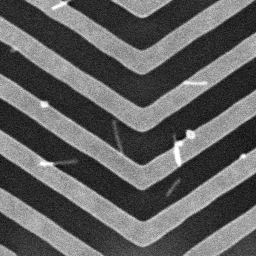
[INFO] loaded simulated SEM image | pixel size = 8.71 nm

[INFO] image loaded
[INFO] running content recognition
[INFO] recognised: groups of lines, slits or small figures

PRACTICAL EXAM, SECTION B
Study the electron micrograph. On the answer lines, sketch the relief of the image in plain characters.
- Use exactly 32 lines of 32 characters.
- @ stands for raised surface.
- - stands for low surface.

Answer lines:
----@@@@-------@@@@@@------@@@@-
-----@@@@@------@@@------@@@@@--
@------@@@@-------------@@@@----
@@-------@@@@---------@@@@@-----
@@@@------@@@@-------@@@@------@
-@@@@-------@@@@---@@@@-------@@
--@@@@@------@@@@@@@@@-------@@@
----@@@@-------@@@@@@------@@@@-
-----@@@@@------@@@-------@@@@--
-------@@@@-------------@@@@----
@@------@@@@@----------@@@@-----
@@@-------@@@@-------@@@@-------
@@@@@------@@@@@----@@@@------@@
--@@@@@------@@@@@@@@@-------@@@
----@@@@------@@@@@@@------@@@@@
-----@@@@@------@@@@------@@@@--
-------@@@@-------------@@@@@---
@@------@@@@@----------@@@@-----
@@@-------@@@@-------@@@@@------
@@@@@------@@@@@----@@@@------@@
--@@@@-------@@@@-@@@@@------@@@
---@@@@@------@@@@@@@-------@@@@
-----@@@@-------@@@@------@@@@@-
-------@@@@------@-------@@@@---
@@------@@@@@----------@@@@-----
@@@-------@@@@--------@@@@------
@@@@@------@@@@@----@@@@-------@
--@@@@------@@@@@--@@@@------@@@
---@@@@@------@@@@@@@@------@@@@
-----@@@@------@@@@@------@@@@@-
------@@@@@------@@------@@@@---
@-------@@@@-----------@@@@@----